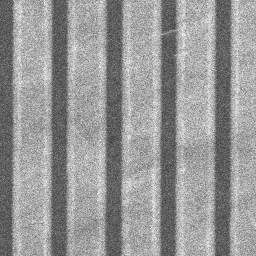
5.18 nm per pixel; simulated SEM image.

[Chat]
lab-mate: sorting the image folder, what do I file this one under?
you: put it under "parallel lines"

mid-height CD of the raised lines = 0.166 um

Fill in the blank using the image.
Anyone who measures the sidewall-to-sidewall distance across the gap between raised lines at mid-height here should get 118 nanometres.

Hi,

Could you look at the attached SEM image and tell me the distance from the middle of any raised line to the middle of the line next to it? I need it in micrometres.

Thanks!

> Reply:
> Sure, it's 0.282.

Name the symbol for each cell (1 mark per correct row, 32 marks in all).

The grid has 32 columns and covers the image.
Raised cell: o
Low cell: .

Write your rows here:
..oooo...oooo...oooo...ooo...ooo
..oooo...oooo...oooo...ooo...ooo
..oooo...oooo...oooo...ooo...ooo
..oooo...oooo...oooo...ooo...ooo
..oooo...oooo...oooo...ooo...ooo
..oooo...oooo...oooo...ooo...ooo
..oooo...oooo...oooo..oooo...ooo
..oooo...oooo...oooo...ooo...ooo
..oooo...oooo...oooo...ooo...ooo
..oooo...oooo...oooo...ooo...ooo
..oooo...oooo...oooo...ooo...ooo
..oooo...oooo...oooo...ooo...ooo
..oooo...oooo...oooo...ooo...ooo
..oooo...oooo...oooo...ooo...ooo
..oooo...oooo...oooo...ooo...ooo
..oooo...oooo...oooo...ooo...ooo
..oooo...oooo...oooo...ooo...ooo
..oooo...oooo...oooo...ooo...ooo
..oooo...oooo...oooo...ooo...ooo
..oooo...oooo...oooo...ooo...ooo
..oooo...oooo...oooo...ooo...ooo
..oooo...oooo...oooo...ooo...ooo
..oooo...oooo...oooo...ooo...ooo
..oooo...oooo...oooo...ooo...ooo
..oooo...oooo...oooo...ooo...ooo
..oooo...oooo...oooo...ooo...ooo
..oooo...oooo...oooo...ooo...ooo
..oooo...oooo...oooo...ooo...ooo
..oooo...oooo...oooo...ooo...ooo
..oooo...oooo...oooo...ooo...ooo
..oooo...oooo...oooo...ooo...ooo
..oooo...oooo...oooo...ooo...ooo